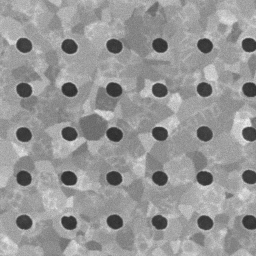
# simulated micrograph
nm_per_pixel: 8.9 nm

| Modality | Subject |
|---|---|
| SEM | a regular array of holes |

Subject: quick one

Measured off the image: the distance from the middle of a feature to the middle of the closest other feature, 0.392 um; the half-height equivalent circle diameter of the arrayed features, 141 nm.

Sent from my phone